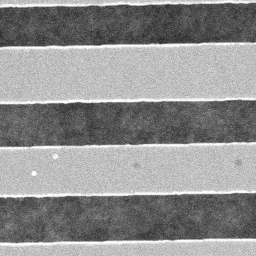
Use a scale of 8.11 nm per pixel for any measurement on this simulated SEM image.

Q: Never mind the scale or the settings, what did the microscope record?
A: lines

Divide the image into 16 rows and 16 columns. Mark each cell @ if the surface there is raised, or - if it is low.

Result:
----------------
----------------
----------------
@@@@@@@@@@@@@@@@
@@@@@@@@@@@@@@@@
@@@@@@@@@@@@@@@@
----------------
----------------
----------------
@@@@@@@@@@@@@@@@
@@@@@@@@@@@@@@@@
@@@@@@@@@@@@@@@@
----------------
----------------
----------------
@@@@@@@@@@@@@@@@